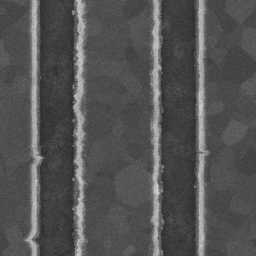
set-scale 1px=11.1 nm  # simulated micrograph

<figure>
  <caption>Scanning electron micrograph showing one or a few lines or trenches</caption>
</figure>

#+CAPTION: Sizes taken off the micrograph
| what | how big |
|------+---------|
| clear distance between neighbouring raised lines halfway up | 0.496 µm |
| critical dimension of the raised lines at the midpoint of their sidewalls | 846 nanometers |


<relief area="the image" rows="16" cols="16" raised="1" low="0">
1100011111000111
1100011111000111
1100011111000111
1100011111000111
1100011111000111
1100011111000111
1100011111000111
1100011111000111
1100011111000111
1100011111000111
1100011111000111
1100011111000111
1100011111000111
1100011111000111
1100011111000111
1100011111000111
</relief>